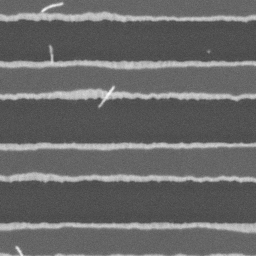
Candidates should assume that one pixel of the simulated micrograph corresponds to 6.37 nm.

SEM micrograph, lines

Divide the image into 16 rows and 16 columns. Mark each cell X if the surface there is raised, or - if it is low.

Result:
XXXXXXXXXXXXXXXX
----------------
----------------
----------------
XXXXXXXXXXXXXXXX
XXXXXXXXXXXXXXXX
----------------
----------------
----------------
XXXXXXXXXXXXXXXX
XXXXXXXXXXXXXXXX
----------------
----------------
----------------
XXXXXXXXXXXXXXXX
XXXXXXXXXXXXXXXX